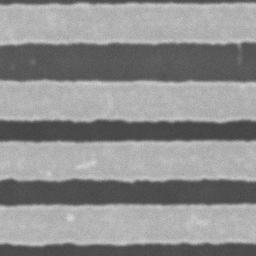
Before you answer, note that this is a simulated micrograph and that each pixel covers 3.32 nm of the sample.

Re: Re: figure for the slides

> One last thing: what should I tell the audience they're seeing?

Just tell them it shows lines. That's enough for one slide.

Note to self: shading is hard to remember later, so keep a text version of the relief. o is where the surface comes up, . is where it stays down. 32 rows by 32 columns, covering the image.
..........o....ooooo.o.....ooooo
oooooooooooooooooooooooooooooooo
oooooooooooooooooooooooooooooooo
oooooooooooooooooooooooooooooooo
oooooooooooooooooooooooooooooooo
o...............................
................................
................................
................................
................................
oooooooooooooooooooooooooooooooo
oooooooooooooooooooooooooooooooo
oooooooooooooooooooooooooooooooo
oooooooooooooooooooooooooooooooo
oooooooooooooooooooooooooooooooo
................................
................................
................................
oooooooooooooooooooooooooooooooo
oooooooooooooooooooooooooooooooo
oooooooooooooooooooooooooooooooo
oooooooooooooooooooooooooooooooo
......oo.......oo..oo..........o
................................
................................
................................
oooooooooooooooooooooooooooooooo
oooooooooooooooooooooooooooooooo
oooooooooooooooooooooooooooooooo
oooooooooooooooooooooooooooooooo
..oooo....o...oo................
................................